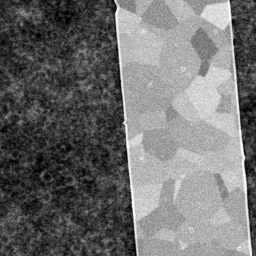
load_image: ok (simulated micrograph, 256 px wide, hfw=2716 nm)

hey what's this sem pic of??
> one or a few lines or trenches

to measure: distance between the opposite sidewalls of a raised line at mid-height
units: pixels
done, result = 113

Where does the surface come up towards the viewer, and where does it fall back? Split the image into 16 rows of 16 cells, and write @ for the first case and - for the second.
-------@@@@@@@--
-------@@@@@@@--
-------@@@@@@@@-
-------@@@@@@@@-
--------@@@@@@@-
--------@@@@@@@-
--------@@@@@@@-
--------@@@@@@@-
--------@@@@@@@-
--------@@@@@@@-
--------@@@@@@@-
--------@@@@@@@-
--------@@@@@@@-
--------@@@@@@@-
--------@@@@@@@@
---------@@@@@@@